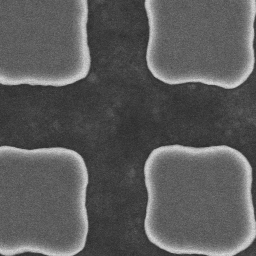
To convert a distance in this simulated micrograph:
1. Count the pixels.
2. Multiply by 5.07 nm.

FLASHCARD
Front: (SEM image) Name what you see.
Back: raised bodies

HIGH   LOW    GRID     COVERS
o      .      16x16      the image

ooooo....ooooooo
ooooo....ooooooo
ooooo....ooooooo
ooooo....ooooooo
ooooo.....oooooo
................
................
................
................
oooo......ooooo.
ooooo....ooooooo
ooooo....ooooooo
ooooo....ooooooo
ooooo....ooooooo
ooooo....ooooooo
ooooo.....ooooo.